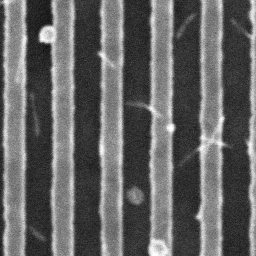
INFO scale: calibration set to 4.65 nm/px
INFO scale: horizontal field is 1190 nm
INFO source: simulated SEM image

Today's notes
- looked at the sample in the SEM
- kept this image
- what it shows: lines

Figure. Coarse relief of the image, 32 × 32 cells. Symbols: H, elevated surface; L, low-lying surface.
LHHLLLLHHLLLLHHLLLLHHLLLLHHHLLLH
LHHLLLLHHLLLLHHLLLLHHLLLLHHHLLLL
LHHLLLLHHLLLLHHLLLLHHLLLLHHHLLLL
LHHLLLHHHLLLLHHLLLLHHLLLLHHHLLLL
LHHLLHHHHLLLLHHLLLLHHLLLLHHHLLLH
LHHLLLHHHLLLLHHLLLLHHLLLLHHHLLLH
LHHLLLLHHLLLLHHLLLLHHLLLLHHHLLLH
LHHLLLLHHLLLLHHLLLLHHLLLLHHHLLLL
LHHLLLLHHLLLLHHLLLLHHLLLLHHHLLLL
LHHLLLLHHLLLLHHLLLLHHLLLLHHHLLLL
LHHLLLLHHLLLLHHLLLLHHLLLLHHHLLLH
LHHLLLLHHLLLLHHLLLLHHLLLLHHHLLLH
LHHLLLLHHLLLLHHLLLLHHLLLLHHHLLLH
LHHLLLLHHLLLLHHLLLLHHLLLLHHHLLLH
LHHLLLLHHLLLLHHLLLLHHLLLLHHHLLLL
LHHLLLLHHLLLLHHLLLLHHHLLLHHHLLLH
LHHLLLLHHLLLLHHLLLLHHHLLLHHHLLLH
LHHLLLLHHLLLLHHLLLLHHLLLLHHHLLLH
LHHLLLLHHLLLLHHLLLLHHLLLLHHHLLLH
LHHLLLLHHLLLLHHLLLLHHLLLLHHHLLLH
LHHLLLLHHLLLLHHLLLLHHLLLLHHHLLLH
LHHLLLLHHLLLLHHLLLLHHLLLLHHHLLLH
LHHLLLLHHLLLLHHLLLLHHLLLLHHHLLLL
LHHLLLLHHLLLLHHLLLLHHLLLLHHHLLLH
LHHLLLLHHLLLLHHLLLLHHLLLLHHHLLLH
LHHLLLLHHLLLLHHLLLLHHLLLLHHHLLLH
LHHLLLLHHLLLLHHLLLLHHLLLLHHHLLLL
LHHLLLLHHLLLLHHLLLLHHLLLLHHHLLLH
LHHLLLLHHLLLLHHLLLLHHLLLLHHHLLLH
LHHLLLLHHLLLLHHLLLLHHLLLLHHHLLLH
LHHLLLLHHLLLLHHLLLLHHLLLLHHHLLLH
LHHLLLLHHLLLLHHLLLLHHLLLLHHHLLLH